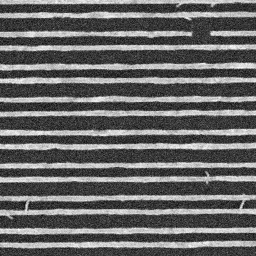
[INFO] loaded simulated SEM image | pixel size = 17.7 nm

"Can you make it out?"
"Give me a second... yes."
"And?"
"parallel lines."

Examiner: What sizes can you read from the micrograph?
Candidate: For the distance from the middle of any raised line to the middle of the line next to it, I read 291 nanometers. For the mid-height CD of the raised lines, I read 79.8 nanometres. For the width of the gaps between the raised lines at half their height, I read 195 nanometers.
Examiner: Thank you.